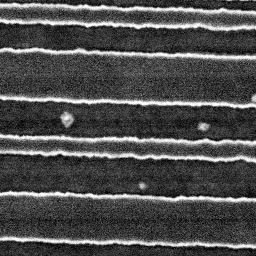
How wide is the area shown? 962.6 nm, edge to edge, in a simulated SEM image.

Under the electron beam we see lines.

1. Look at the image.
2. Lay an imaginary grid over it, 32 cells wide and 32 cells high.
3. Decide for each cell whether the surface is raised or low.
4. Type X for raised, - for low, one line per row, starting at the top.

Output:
--------------------------------
XXXXXXXXXXXXXXXXXXXXXXXXXXXXXXXX
XXXXXXXXXXXXXXXXXXXXXXXXXXXXXXXX
--------------------------XXXXXX
--------------------------------
--------------------------------
XXXXXXXXXXXX--------------------
XXXXXXXXXXXXXXXXXXXXXXXXXXXXXXXX
XXXXXXXXXXXXXXXXXXXXXXXXXXXXXXXX
XXXXXXXXXXXXXXXXXXXXXXXXXXXXXXXX
XXXXXXXXXXXXXXXXXXXXXXXXXXXXXXXX
XXXXXXXXXXXXXXXXXXXXXXXXXXXXXXXX
---XXXXXXXXXXXXXXXXXXXXXXXXXXXXX
--------------------------------
--------X-----------------------
--------------------------------
--------------------------------
XXXXXXXXXXXXXXXXXXXXXX---X------
XXXXXXXXXXXXXXXXXXXXXXXXXXXXXXXX
------------XXXXXXXXXXXXXXXXXXXX
--------------------------------
--------------------------------
--------------------------------
--------------------------------
XXXXXXXXXXXXXXXXX---------------
XXXXXXXXXXXXXXXXXXXXXXXXXXXXXXXX
XXXXXXXXXXXXXXXXXXXXXXXXXXXXXXXX
XXXXXXXXXXXXXXXXXXXXXXXXXXXXXXXX
XXXXXXXXXXXXXXXXXXXXXXXXXXXXXXXX
XXXXXXXXXXXXXXXXXXXXXXXXXXXXXXXX
------------X--XXXXXXXXXXXXXXXXX
--------------------------------